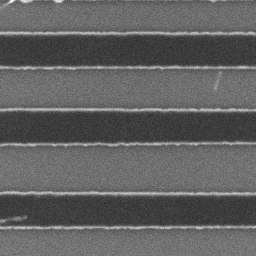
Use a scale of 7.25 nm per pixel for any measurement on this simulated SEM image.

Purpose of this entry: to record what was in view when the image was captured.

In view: lines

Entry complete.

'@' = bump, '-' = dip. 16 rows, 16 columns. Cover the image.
----------------
----------------
@@@@@@@@@@@@@@@@
@@@@@@@@@@@@@@@@
----------------
----------------
----------------
@@@@@@@@@@@@@@@@
@@@@@@@@@@@@@@@@
----------------
----------------
----------------
@@@@@@@@@@@@@@@@
@@@@@@@@@@@@@@@@
----------------
----------------